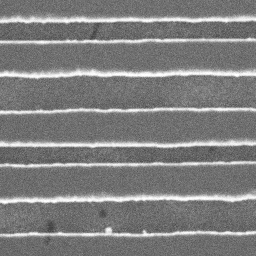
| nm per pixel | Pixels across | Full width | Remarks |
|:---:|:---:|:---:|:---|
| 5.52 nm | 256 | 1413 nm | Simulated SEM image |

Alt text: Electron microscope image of lines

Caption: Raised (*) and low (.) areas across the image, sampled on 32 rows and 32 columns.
********************************
********************************
**************************.***..
................................
................................
********************************
********************************
********************************
********************************
...**...........................
................................
................................
................................
................................
********************************
********************************
********************************
********************************
................................
................................
...................**.**********
********************************
********************************
********************************
********************************
................................
................................
................................
................................
********************************
********************************
********************************